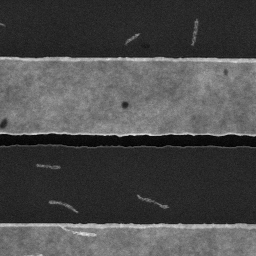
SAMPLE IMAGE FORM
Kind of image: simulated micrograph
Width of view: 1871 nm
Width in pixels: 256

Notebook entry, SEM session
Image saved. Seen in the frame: lines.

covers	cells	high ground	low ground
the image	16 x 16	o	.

................
................
................
................
oooooooooooooooo
oooooooooooooooo
oooooooooooooooo
oooooooooooooooo
................
................
................
................
................
................
oooooooooooooooo
oooooooooooooooo